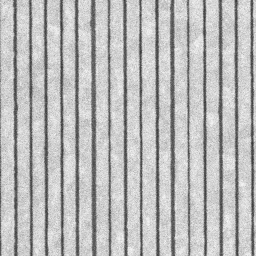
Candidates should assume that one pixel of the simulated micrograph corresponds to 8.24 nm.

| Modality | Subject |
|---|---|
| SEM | parallel lines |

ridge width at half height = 101 nm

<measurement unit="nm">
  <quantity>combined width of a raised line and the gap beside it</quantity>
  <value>130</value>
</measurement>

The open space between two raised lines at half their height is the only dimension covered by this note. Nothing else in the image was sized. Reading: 3.5 px